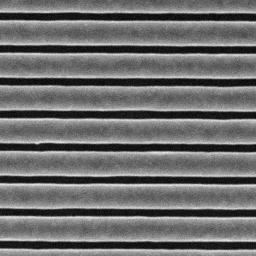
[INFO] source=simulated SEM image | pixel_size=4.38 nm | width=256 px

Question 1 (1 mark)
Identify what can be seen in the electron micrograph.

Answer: parallel lines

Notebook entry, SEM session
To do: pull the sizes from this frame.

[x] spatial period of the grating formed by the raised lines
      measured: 143 nm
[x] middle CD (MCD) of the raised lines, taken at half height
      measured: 105 nm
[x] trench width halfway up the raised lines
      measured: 37.3 nm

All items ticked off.